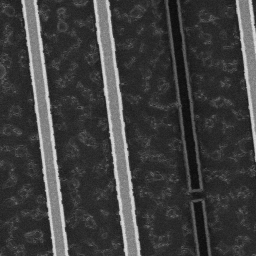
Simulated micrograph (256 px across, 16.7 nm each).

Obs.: one or a few lines or trenches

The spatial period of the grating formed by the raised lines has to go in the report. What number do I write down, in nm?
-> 1180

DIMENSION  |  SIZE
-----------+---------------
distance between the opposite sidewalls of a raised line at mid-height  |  194 nanometres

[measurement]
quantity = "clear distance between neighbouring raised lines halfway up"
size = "983 nanometers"